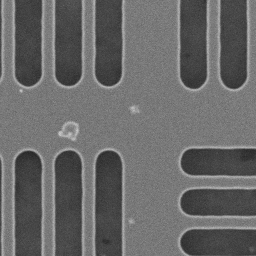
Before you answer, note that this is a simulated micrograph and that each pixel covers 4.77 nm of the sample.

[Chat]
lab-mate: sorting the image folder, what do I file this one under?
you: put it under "groups of lines, slits or small figures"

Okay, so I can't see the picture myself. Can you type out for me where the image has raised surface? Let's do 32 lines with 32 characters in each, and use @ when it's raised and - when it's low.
@@---@@---@@---@@@@@@@----@@---@
@@---@@---@@---@@@@@@@----@----@
@@---@@---@@---@@@@@@@----@----@
@@---@@---@@---@@@@@@@----@@---@
@@---@@---@@---@@@@@@@----@----@
@@---@@---@@---@@@@@@@----@@---@
@@---@@---@@---@@@@@@@----@@---@
@@---@@---@@---@@@@@@@----@----@
@@---@@---@@---@@@@@@@----@----@
@@---@@---@@---@@@@@@@@---@@---@
@@@-@@@@-@@@@--@@@@@@@@--@@@--@@
@@@@@@@@@@@@@@@@@@@@@@@@@@@@@@@@
@@@@@@@@@@@@@@@@@@@@@@@@@@@@@@@@
@@@@@@@@@@@@@@@@@@@@@@@@@@@@@@@@
@@@@@@@@@@@@@@@@@@@@@@@@@@@@@@@@
@@@@@@@@@@@@@@@@@@@@@@@@@@@@@@@@
@@@@@@@@@@@@@@@@@@@@@@@@@@@@@@@@
@@@@@@@@@@@@@@@@@@@@@@@@@@@@@@@@
@@@@@@@@@@@@@@@@@@@@@@@@@@@@@@@@
@@---@@---@@---@@@@@@@@---------
@@---@@---@@---@@@@@@@@---------
@@---@@---@@---@@@@@@@@---------
@@---@@---@@---@@@@@@@@@@@@@@@@@
@@---@@---@@---@@@@@@@@@@@@@@@@@
@@---@@---@@---@@@@@@@@---------
@@---@@---@@---@@@@@@@@---------
@@---@@---@@---@@@@@@@@---------
@@---@@---@@---@@@@@@@@@@@@@@@@@
@@---@@---@@---@@@@@@@@@@@@@@@@@
@@---@@---@@---@@@@@@@@---------
@@---@@---@@---@@@@@@@@---------
@@---@@---@@---@@@@@@@@---------